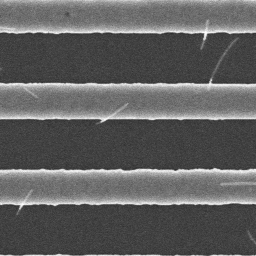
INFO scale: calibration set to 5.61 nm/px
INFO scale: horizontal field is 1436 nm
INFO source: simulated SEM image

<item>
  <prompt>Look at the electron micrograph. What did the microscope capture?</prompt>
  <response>lines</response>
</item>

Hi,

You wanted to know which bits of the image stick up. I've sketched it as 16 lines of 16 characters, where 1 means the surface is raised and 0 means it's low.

1111111111111111
1111111111111111
0000000000000000
0000000000000000
0000000000000000
1111111111111111
1111111111111111
0000000000000000
0000000000000000
0000000000000000
0000000000000000
1111111111111111
1111111111111111
0000000000000000
0000000000000000
0000000000000000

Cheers